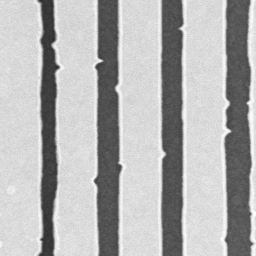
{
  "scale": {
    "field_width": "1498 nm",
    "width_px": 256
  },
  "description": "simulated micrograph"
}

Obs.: one or a few lines or trenches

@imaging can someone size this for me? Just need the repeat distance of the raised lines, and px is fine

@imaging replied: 64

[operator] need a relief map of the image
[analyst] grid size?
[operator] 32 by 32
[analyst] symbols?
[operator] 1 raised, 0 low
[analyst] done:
11111001111100011111000111110001
11111001111100011111000111110001
11111001111100011111000111110001
11111001111100011111000111110001
11111001111100011111000111110001
11111001111100011111000111110001
11111001111100011111000111110001
11111001111100011111000111110001
11111001111100011111000111110001
11111001111100011111000111110000
11111001111100011111000111110001
11111001111100011111000111110001
11111001111100011111000111110001
11111001111100011111000111110001
11111001111100011111000111110001
11111001111100011111000111110001
11111001111100011111000111110001
11111001111100011111000111110001
11111001111100011111000111110001
11111001111100011111000111110001
11111001111100011111000111110000
11111001111100011111000111110001
11111001111100011111000111110001
11111001111100011111000111110001
11111001111100011111000111110001
11111001111100011111000111110001
11111001111100011111000111110001
11111001111100011111000111110001
11111001111100011111000111110000
11111001111100011111000111110001
11111001111100011111000111110000
11111001111100011111000111110000